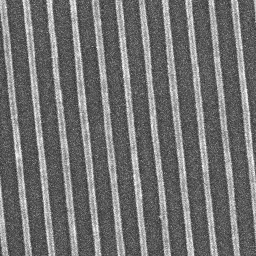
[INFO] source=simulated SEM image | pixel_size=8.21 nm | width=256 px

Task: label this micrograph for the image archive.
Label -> parallel lines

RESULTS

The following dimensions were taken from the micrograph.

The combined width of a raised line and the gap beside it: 189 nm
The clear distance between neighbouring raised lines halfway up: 0.146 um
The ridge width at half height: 41.8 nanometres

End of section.